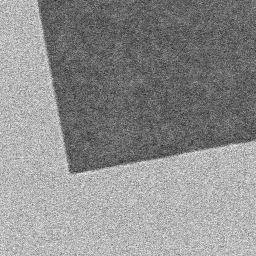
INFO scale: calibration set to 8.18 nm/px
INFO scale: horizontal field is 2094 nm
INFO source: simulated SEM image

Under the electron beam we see one or a few lines or trenches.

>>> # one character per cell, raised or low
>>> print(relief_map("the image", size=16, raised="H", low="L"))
HHLLLLLLLLLLLLLL
HHHLLLLLLLLLLLLL
HHHLLLLLLLLLLLLL
HHHLLLLLLLLLLLLL
HHHLLLLLLLLLLLLL
HHHLLLLLLLLLLLLL
HHHLLLLLLLLLLLLL
HHHHLLLLLLLLLLLL
HHHHLLLLLLLLLLLL
HHHHLLLLLLLLHHHH
HHHHLLLHHHHHHHHH
HHHHHHHHHHHHHHHH
HHHHHHHHHHHHHHHH
HHHHHHHHHHHHHHHH
HHHHHHHHHHHHHHHH
HHHHHHHHHHHHHHHH